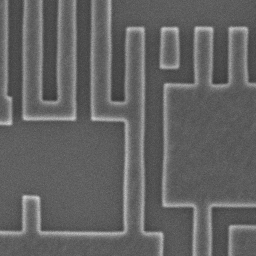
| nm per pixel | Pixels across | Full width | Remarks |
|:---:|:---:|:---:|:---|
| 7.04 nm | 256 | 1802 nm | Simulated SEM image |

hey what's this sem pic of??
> wiring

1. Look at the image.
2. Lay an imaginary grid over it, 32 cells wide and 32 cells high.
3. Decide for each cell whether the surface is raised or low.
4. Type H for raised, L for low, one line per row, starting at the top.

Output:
HLLHHLLHHLLHHHLLLLLLLLLLLLLLLLLL
HLLHHLLHHLLHHHLLLLLLLLLLLLLLLLLL
HLLHHLLHHLLHHHLLLLLLLLLLLLLLLLLL
HLLHHLLHHLLHHHLLHHLLHHLLLHLLLHHL
HLLHHLLHHLLHHHLLHHLLHHLLHHHLLHHL
HLLHHLLHHLLHHHLLHHLLHHLLHHLLLHHL
HLLHHLLHHLLHHHLLHHLLHHLLHHLLLHHL
HLLHHLLHHLLHHHLLHHLLHHLLHHLLLHHL
HLLHHLLHHLLHHHLLHHLLLLLLHHLLLHHL
HLLHHLLHHLLHHHLLHHLLLLLLHHLLLHHL
HLLHHLLHHLLHHHLLHHLLLHLLHHHLHHHH
HLLHHLLHHLLHHHLLHHLLLHHHHHHHHHHH
HLLHHHLHHLLHHHLHHHLLLHHHHHHHHHHH
HLLHHHHHHLLHHHHHHHLLLHHHHHHHHHHH
HLLHHHHHHLLHHHHHHHLLLHHHHHHHHHHH
HLLLLLLLLLLLLLLLHHLLLHHHHHHHHHHH
LLLLLLLLLLLLLLLLHHLLLHHHHHHHHHHH
LLLLLLLLLLLLLLLLHHLLLHHHHHHHHHHH
LLLLLLLLLLLLLLLLHHLLLHHHHHHHHHHH
LLLLLLLLLLLLLLLLHHLLLHHHHHHHHHHH
LLLLLLLLLLLLLLLLHHLLHHHHHHHHHHHH
LLLLLLLLLLLLLLLLHHLLHHHHHHHHHHHH
LLLLLLLLLLLLLLLLHHLLHHHHHHHHHHHH
LLLLLLLLLLLLLLLLHHLLHHHHHHHHHHHH
LLLLLLLLLLLLLLLLHHLLHHHHHHHHHHHH
LLLHHLLLLLLLLLLLHHLLHHHHHHHHHHHH
LLLHHLLLLLLLLLLLHHLLLLLLHHLLLLLL
LLLHHLLLLLLLLLLLHHLLLLLLHHLLLLLL
LLLHHLLLLLLLLLLLHHLLLLLLHHLLLHHH
HHHHHHHHHHHHHHHHHHHHLLLLHHLLLHHH
HHHHHHHHHHHHHHHHHHHHLLLLHHLLLHHH
HHHHHHHHHHHHHHHHHHHHLLLLHHLLLHHH